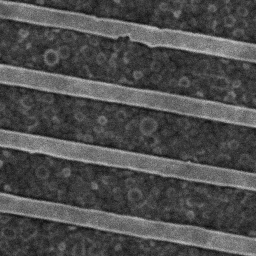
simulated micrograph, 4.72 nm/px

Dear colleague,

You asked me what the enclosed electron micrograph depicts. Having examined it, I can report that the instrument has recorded one or a few lines or trenches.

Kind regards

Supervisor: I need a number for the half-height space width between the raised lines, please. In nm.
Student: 223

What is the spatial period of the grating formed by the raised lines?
301 nm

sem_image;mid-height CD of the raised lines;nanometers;76.2